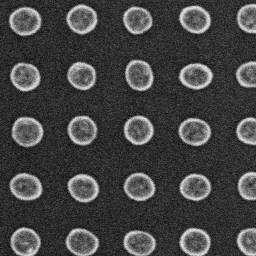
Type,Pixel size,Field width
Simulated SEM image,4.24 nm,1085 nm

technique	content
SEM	a regular array of raised bodies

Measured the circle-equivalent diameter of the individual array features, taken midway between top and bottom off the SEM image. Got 117 nm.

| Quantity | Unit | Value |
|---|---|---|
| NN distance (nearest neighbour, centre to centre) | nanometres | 233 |